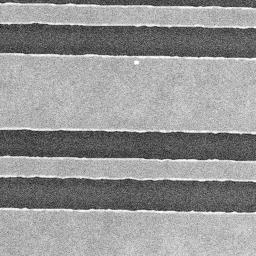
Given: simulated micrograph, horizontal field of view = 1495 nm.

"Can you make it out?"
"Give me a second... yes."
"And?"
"lines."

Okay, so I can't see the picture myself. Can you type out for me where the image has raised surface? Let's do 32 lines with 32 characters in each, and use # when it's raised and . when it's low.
###.............................
################################
################################
................................
................................
................................
................................
################################
################################
################################
################################
################################
################################
################################
################################
################################
..........................######
................................
................................
................................
################################
################################
........................########
................................
................................
................................
######################.##.......
################################
################################
################################
################################
################################